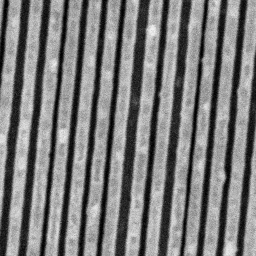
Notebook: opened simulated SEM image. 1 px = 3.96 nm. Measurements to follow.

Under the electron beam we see parallel lines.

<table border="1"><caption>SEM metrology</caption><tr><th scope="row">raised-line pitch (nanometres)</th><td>78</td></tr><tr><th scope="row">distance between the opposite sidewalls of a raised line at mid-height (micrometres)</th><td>0.0458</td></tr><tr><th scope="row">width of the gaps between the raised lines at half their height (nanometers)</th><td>31.5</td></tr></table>